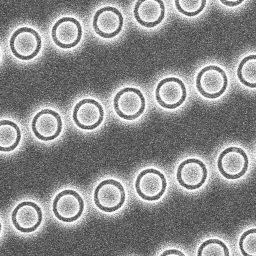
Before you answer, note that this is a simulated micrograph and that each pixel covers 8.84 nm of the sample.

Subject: a regular array of ring-shaped grooves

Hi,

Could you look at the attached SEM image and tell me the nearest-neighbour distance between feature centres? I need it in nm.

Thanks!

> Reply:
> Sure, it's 375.